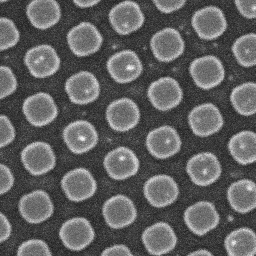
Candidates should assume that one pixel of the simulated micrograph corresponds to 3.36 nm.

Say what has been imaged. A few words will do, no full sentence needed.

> a regular array of raised bodies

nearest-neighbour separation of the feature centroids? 159 nm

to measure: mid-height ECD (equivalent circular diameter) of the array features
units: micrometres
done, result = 0.108